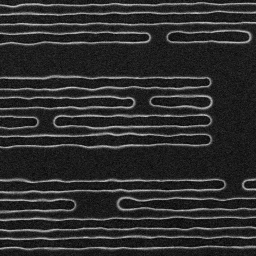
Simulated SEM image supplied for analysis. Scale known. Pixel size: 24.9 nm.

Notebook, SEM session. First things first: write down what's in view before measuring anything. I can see groups of lines, slits or small figures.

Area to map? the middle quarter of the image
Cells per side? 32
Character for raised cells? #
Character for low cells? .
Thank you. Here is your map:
################################
################################
################################
......##........................
................................
................................
################################
################################
..##..........#..#####..........
.................#####..........
.................#######........
################################
################################
................................
................................
.##......................###....
################################
#########...###...##############
................................
................................
#####..........#################
################################
################################
################################
################################
################################
################################
################################
################################
................................
................................
.............##..............###